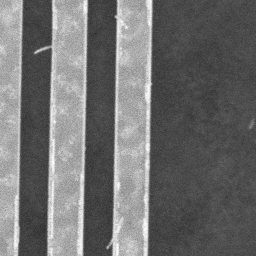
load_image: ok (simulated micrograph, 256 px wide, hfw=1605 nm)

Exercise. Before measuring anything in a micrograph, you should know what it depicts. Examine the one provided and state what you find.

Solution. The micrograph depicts one or a few lines or trenches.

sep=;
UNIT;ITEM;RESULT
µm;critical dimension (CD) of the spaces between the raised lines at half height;0.198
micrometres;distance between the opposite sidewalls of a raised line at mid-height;0.209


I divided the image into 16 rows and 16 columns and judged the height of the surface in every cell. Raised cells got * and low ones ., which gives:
*..**..**.......
*..**..**.......
*..**..**.......
*..**..**.......
*..**..**.......
*..**..**.......
*..**..**.......
*..**..**.......
*..**..**.......
*..**..**.......
*..**..**.......
*..**..**.......
*..**..**.......
*..**..**.......
*..**..**.......
*..**..**.......